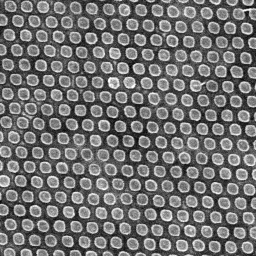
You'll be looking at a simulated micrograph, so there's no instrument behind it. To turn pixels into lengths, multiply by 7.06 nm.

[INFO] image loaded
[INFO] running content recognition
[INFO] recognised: a regular array of raised bodies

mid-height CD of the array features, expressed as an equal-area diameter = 80.8 nm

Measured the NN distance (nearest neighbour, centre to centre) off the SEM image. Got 113 nm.